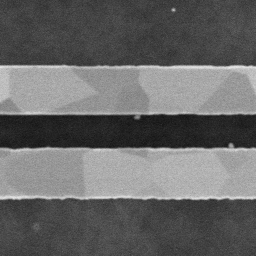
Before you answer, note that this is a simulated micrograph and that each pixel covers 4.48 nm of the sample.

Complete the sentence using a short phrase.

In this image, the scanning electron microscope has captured lines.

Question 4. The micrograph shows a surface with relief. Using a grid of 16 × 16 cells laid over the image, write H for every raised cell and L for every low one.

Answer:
LLLLLLLLLLLLLLLL
LLLLLLLLLLLLLLLL
LLLLLLLLLLLLLLLL
LLLLLLLLLLLLLLLL
HHHHHHHHHHHHHHHH
HHHHHHHHHHHHHHHH
HHHHHHHHHHHHHHHH
LLLLLLLLLLLLLLLL
LLLLLLLLLLLLLLLL
HHHHHHHHHHHHHHHH
HHHHHHHHHHHHHHHH
HHHHHHHHHHHHHHHH
LLLLLLLLLLLLLLLL
LLLLLLLLLLLLLLLL
LLLLLLLLLLLLLLLL
LLLLLLLLLLLLLLLL